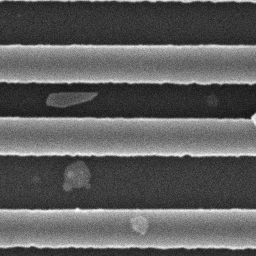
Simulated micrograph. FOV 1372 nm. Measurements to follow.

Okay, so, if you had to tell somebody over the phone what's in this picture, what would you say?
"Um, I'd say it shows lines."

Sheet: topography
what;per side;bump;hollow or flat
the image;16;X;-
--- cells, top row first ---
----------------
----------------
----------------
XXXXXXXXXXXXXXXX
XXXXXXXXXXXXXXXX
----------------
----------------
XXXXXXXXXXXXXXXX
XXXXXXXXXXXXXXXX
XXXXXXXXXXXXXXXX
----------------
----------------
----------------
XXXXXXXXXXXXXXXX
XXXXXXXXXXXXXXXX
--------------X-